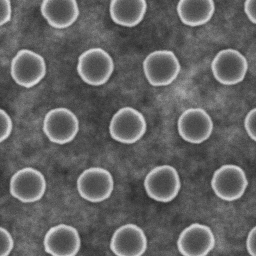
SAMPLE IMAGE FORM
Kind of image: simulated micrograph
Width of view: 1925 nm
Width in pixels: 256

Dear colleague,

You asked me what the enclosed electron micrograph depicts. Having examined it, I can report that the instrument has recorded a regular array of raised bodies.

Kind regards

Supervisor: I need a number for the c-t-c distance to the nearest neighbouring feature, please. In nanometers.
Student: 498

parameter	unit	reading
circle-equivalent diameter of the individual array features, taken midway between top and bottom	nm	256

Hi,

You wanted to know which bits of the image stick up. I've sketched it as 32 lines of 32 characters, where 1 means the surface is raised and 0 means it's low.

10000111100000111100001111100001
10000111110000111100001111100001
10000011100000111100000111000000
00000000000000000000000000000000
00000000000000000000000000000000
00000000000000000000000000000000
00010000000110000001100000001100
00111000001111000011110000011110
00111100001111000011110000011110
00111000001111000011110000011100
00110000000000000001100000000000
00000000000000000000000000000000
00000000000000000000000000000000
00000000000000000000000000000000
10000011100000111100000111000001
10000011110000111100001111000001
10000011110000111100000111000001
00000001100000011000000111000000
00000000000000000000000000000000
00000000000000000000000000000000
00000000000000000000000000000000
00111000000110000001110000011100
01111000001111000011110000011110
01111100001111000011110000011110
00111000001110000001110000011100
00000000000000000000000000000000
00000000000000000000000000000000
00000000000000000000000000000000
00000001100000011000000011000000
10000011110000111100000111100001
10000011110000111100001111100001
10000011110000111100000111000001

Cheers